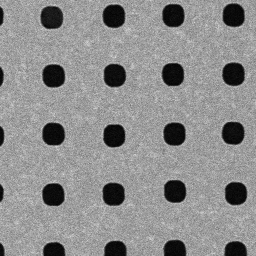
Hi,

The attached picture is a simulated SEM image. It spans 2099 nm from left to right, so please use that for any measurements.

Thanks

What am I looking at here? a regular array of holes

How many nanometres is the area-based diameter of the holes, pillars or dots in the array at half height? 192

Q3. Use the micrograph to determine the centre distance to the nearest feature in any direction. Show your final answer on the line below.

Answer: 0.481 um